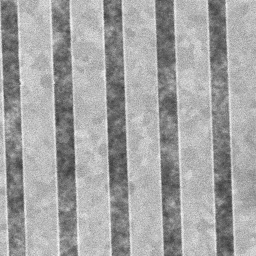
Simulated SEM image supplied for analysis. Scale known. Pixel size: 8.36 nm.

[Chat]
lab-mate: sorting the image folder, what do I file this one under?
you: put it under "parallel lines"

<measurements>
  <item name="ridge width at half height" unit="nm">271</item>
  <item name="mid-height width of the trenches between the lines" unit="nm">162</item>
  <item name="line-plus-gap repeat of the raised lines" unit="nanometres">437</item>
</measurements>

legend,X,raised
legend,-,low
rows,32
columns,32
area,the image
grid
--XXXX---XXXX--XXXX---XXXX--XXXX
--XXXX---XXXX--XXXX---XXXX--XXXX
--XXXX---XXXX--XXXX---XXXX--XXXX
--XXXX---XXXX--XXXX---XXXX--XXXX
--XXXX---XXXX---XXX---XXXX--XXXX
--XXXX---XXXX---XXX---XXXX--XXXX
--XXXX---XXXX---XXXX--XXXX---XXX
--XXXXX--XXXX---XXXX--XXXX---XXX
---XXXX--XXXX---XXXX--XXXX---XXX
---XXXX--XXXX---XXXX--XXXX---XXX
---XXXX--XXXX---XXXX--XXXX---XXX
---XXXX--XXXX---XXXX--XXXX---XXX
---XXXX--XXXX---XXXX--XXXX---XXX
---XXXX--XXXX---XXXX--XXXX---XXX
---XXXX--XXXX---XXXX--XXXX---XXX
---XXXX--XXXX---XXXX--XXXX---XXX
---XXXX--XXXX---XXXX--XXXX---XXX
---XXXX--XXXX---XXXX--XXXX---XXX
X--XXXX--XXXX---XXXX--XXXX---XXX
X--XXXX--XXXX---XXXX--XXXXX--XXX
X--XXXX--XXXX---XXXX---XXXX--XXX
X--XXXX---XXX---XXXX---XXXX--XXX
X--XXXX---XXXX--XXXX---XXXX--XXX
X--XXXX---XXXX--XXXX---XXXX--XXX
X--XXXX---XXXX--XXXX---XXXX--XXX
X--XXXX---XXXX--XXXX---XXXX--XXX
X--XXXX---XXXX--XXXX---XXXX--XXX
X--XXXX---XXXX--XXXX---XXXX--XXX
X--XXXX---XXXX--XXXX---XXXX--XXX
X--XXXX---XXXX--XXXX---XXXX--XXX
X--XXXX---XXXX--XXXX---XXXX--XXX
X--XXXX---XXXX--XXXX---XXXX--XXX